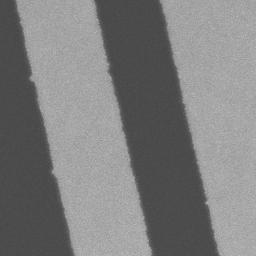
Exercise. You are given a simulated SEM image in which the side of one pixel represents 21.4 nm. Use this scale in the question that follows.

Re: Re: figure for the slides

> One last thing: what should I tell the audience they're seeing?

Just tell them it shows one or a few lines or trenches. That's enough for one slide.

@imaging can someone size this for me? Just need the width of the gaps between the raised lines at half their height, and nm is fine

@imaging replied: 1600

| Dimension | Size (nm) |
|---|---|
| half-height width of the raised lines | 1420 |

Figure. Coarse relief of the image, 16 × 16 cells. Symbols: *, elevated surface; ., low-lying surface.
*.....****......
*.....****......
**....*****.....
**.....****.....
**.....****.....
**.....****.....
**.....*****....
***.....****....
***.....****....
***.....****....
***.....****....
****....*****...
****.....****...
****.....****...
****.....****...
*****....*****..